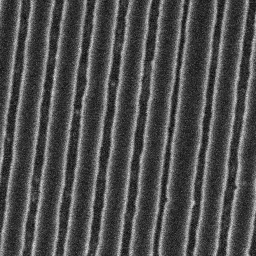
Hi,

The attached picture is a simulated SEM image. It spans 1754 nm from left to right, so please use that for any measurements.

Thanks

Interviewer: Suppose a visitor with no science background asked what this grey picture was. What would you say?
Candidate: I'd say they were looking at parallel lines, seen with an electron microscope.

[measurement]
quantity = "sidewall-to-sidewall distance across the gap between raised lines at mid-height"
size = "0.0612 µm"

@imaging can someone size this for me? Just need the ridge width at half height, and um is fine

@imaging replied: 0.155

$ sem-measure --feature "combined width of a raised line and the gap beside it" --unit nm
220